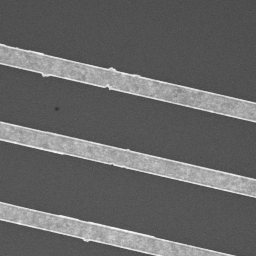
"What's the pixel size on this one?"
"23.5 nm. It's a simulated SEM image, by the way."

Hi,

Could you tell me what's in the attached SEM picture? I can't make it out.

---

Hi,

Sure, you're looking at one or a few lines or trenches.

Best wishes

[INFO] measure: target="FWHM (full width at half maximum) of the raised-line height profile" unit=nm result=398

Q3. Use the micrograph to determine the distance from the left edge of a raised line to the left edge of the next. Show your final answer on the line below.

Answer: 1780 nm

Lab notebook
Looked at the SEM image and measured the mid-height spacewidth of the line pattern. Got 1.35 micrometres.